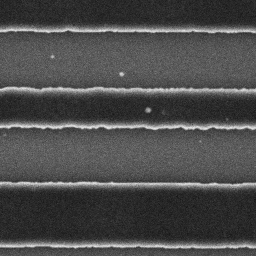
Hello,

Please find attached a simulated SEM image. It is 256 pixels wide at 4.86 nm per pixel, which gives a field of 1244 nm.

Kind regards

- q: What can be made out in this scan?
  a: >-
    lines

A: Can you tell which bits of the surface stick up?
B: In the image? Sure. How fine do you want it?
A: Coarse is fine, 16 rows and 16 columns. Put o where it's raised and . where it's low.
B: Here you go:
oooooooooooooooo
oooooooooooooooo
................
................
................
o...............
oooooooooooooooo
oooooooooooooooo
................
................
................
oooooooooooooo.o
oooooooooooooooo
oooooooooooooooo
oooooooooooooooo
................